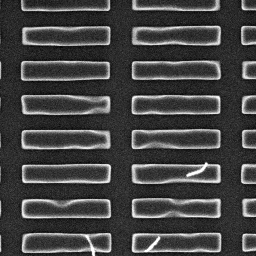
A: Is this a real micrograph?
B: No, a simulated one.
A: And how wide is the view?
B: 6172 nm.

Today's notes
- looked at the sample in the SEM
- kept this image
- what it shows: groups of lines, slits or small figures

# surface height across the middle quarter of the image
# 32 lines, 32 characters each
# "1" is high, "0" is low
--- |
11111111111000000111111111111111
11111111111000000111111111111111
11111111111000000111111111111111
11111111111000000011111011111111
00000000000000000000000000000000
00000000000000000000000000000000
00000000000000000000000000000000
00000000000000000000000000000000
11111100001000000011111111111111
11111111111000000111111111111111
11111111111000000111111111111111
11111111111000000111111111111111
11110000000000000000000000000000
00000000000000000000000000000000
00000000000000000000000000000000
00000000000000000000000000000000
00000000000000000000000000000001
11111111111000000111111111111111
11111111111000000111111111111111
11111111111000000111111111111111
11111111111000000111100001111111
00000000000000000000000000000000
00000000000000000000000000000000
00000000000000000000000000000000
00000000000000000000000000000000
11111111111000000000111111111111
11111111111000000111111111111111
11111111111000000111111111111111
11111111111000000011111111111111
00000000100000000011111110000000
00000000000000000000000000000000
00000000000000000000000000000000